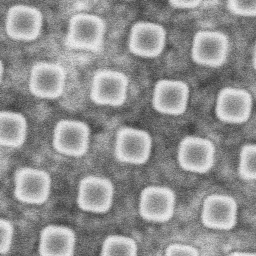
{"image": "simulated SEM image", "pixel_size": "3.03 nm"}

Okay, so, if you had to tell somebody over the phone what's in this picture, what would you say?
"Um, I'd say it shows a regular array of raised bodies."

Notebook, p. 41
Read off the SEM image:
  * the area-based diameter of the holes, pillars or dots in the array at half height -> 103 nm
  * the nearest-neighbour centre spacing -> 0.188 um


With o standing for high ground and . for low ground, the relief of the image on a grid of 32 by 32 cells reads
......................ooo....ooo
.oooo........................ooo
.oooo....ooo....................
.oooo....oooo....ooo............
.ooo.....oooo...ooooo....ooo....
.........ooo....oooo....oooo....
.................ooo....oooo....
........................oooo....
....ooo.........................
....oooo....ooo.................
....oooo....oooo....ooo.........
....oooo....oooo...oooo.....ooo.
............ooo....oooo....oooo.
....................ooo....oooo.
oo.........................oooo.
ooo....ooo......................
ooo....oooo....ooo..............
ooo....oooo....oooo....oo.......
.......oooo....oooo....oooo....o
...............ooo....oooo....oo
.......................ooo....oo
...oo.........................oo
..oooo.....o....................
..oooo....oooo.....o............
..oooo....oooo....oooo..........
..........oooo....oooo....ooo...
..................ooo....oooo...
.........................oooo...
o..........................oo...
o....oooo.......................
o....oooo....oooo...............
.....oooo....oooo....oooo.......